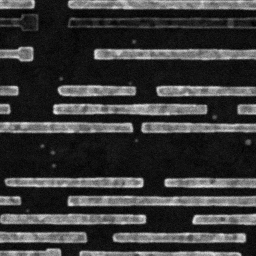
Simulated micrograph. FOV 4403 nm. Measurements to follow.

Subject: wiring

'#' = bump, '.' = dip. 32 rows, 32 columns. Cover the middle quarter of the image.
................................
................................
................................
................................
................................
................................
##################.....#########
##################......########
................................
................................
################################
################################
.....................######.....
................................
................................
#################...############
#################...############
................................
................................
................................
................................
................................
................................
................................
................................
................................
................................
................................
................................
####################.....#######
####################......######
................................